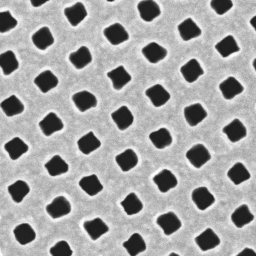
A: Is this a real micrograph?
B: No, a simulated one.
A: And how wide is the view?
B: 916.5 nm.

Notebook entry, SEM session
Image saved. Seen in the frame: a regular array of holes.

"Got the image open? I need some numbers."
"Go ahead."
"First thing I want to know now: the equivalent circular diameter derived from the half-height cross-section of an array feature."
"71.4 nanometers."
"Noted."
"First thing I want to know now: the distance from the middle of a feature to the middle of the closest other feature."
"0.148 microns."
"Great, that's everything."